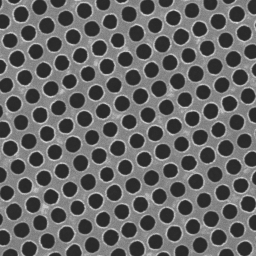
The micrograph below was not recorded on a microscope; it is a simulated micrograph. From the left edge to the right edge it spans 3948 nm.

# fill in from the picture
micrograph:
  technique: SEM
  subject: a regular array of holes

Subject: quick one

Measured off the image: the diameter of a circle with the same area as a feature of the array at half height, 15.3 pixels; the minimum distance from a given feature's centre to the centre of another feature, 304 nanometres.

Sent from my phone